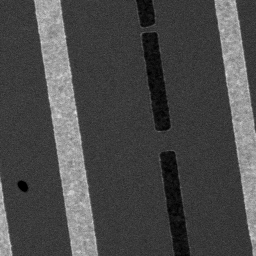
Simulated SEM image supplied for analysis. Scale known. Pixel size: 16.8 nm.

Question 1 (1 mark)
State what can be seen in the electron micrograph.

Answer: one or a few lines or trenches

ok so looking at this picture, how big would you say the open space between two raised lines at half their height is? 1040 nm